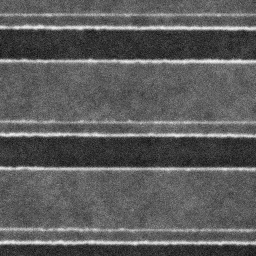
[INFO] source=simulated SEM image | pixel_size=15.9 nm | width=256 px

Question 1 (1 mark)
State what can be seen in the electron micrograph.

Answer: lines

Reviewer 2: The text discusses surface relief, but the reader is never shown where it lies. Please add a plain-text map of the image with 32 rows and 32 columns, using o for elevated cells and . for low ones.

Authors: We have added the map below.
oooooooooooooooooooooooooooooooo
oooooooooooooooooooooooooooooooo
oooooooooooooooooooooooooooooooo
..o.o.o..oo.oo.ooooooooooooooooo
................................
................................
................................
................................
oooooooooooooooooooooooooooooooo
oooooooooooooooooooooooooooooooo
oooooooooooooooooooooooooooooooo
oooooooooooooooooooooooooooooooo
oooooooooooooooooooooooooooooooo
oooooooooooooooooooooooooooooooo
oooooooooooooooooooooooooooooooo
oooooooooooooooooooooooooooooooo
oooooooooooooooooooooooooooooooo
................................
................................
................................
................................
oooooooooooooooooooooooooooooooo
oooooooooooooooooooooooooooooooo
oooooooooooooooooooooooooooooooo
oooooooooooooooooooooooooooooooo
oooooooooooooooooooooooooooooooo
oooooooooooooooooooooooooooooooo
oooooooooooooooooooooooooooooooo
oooooooooooooooooooooooooooooooo
oooooooooooooooooooooooooooooooo
................................
................................